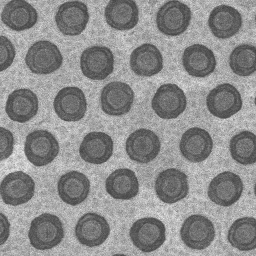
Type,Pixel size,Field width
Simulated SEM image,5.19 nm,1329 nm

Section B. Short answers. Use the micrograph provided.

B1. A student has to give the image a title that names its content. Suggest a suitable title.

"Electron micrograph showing a regular array of ring-shaped grooves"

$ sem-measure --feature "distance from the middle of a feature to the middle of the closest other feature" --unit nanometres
243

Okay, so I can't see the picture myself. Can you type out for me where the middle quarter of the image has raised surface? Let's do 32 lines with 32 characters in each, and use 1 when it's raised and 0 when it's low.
11110011110011110001111001111100
11110001100011111000000011111100
11111000000011111000000111111110
11111100001111111111111111111111
11111111111100011111111111111111
11111111110000001111111100001111
00001111100010000111111000000011
00000111100111100011111001100011
11100111100111100011110011110001
11110011100111100011110011110001
11110011100001000111110011110011
11100011100000001111110000000011
00000111111000001111111000000111
00000111111111111111111100001111
11111111111111111111111111111111
11111111111111111111111111111111
11111111111111111100001111111110
11111100000111111000000111111100
11111000000011110011100011111000
11111011110011100011110011111001
11110011110011100111110011111011
11110011110011110011110011111001
11110001110011110001000011111000
11111000000111110000000111111100
11111000001111111000001111111110
11111111111111111111111111111111
00111111111110000111111110000111
00000111111100000011111000000011
00000011111001110011111000110001
01110001110011111001111001111001
11110001110011111001111001111001
11111001110001110001111001110001